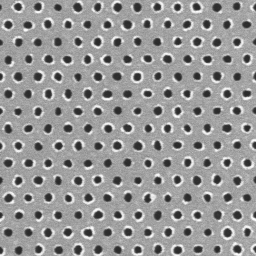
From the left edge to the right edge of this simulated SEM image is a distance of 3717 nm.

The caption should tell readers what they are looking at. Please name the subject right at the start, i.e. a regular array of holes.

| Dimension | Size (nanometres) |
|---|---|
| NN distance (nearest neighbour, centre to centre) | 283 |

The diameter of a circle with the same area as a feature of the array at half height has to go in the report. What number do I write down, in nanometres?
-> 124